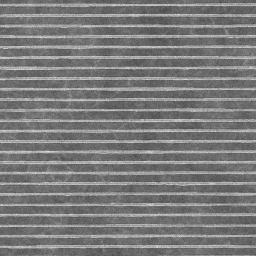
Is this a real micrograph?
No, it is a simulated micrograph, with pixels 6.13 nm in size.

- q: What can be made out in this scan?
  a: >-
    parallel lines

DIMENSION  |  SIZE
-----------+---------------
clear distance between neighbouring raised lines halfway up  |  51.4 nanometres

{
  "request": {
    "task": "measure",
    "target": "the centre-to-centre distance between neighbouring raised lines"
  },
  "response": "64.4 nm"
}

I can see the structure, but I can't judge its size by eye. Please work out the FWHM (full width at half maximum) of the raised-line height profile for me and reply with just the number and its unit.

0.013 micrometres